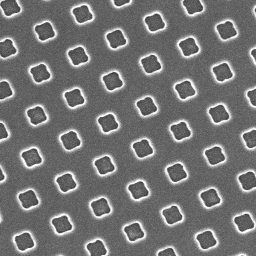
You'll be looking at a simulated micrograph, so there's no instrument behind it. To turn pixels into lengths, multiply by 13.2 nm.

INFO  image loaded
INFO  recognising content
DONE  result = a regular array of holes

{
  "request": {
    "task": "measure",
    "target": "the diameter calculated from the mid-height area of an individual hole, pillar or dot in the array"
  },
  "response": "247 nm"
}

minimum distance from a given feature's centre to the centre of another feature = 41.5 pixels